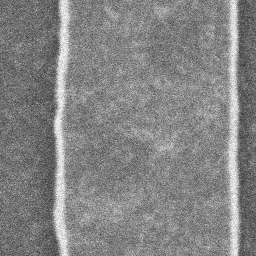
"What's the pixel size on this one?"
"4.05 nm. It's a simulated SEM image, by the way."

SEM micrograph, one or a few lines or trenches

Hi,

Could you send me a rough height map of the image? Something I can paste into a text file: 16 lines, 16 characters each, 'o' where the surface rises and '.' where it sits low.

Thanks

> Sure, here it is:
....ooooooooooo.
....ooooooooooo.
....ooooooooooo.
....ooooooooooo.
....ooooooooooo.
....ooooooooooo.
....ooooooooooo.
....ooooooooooo.
....ooooooooooo.
....ooooooooooo.
....ooooooooooo.
....ooooooooooo.
....ooooooooooo.
....ooooooooooo.
....ooooooooooo.
....ooooooooooo.